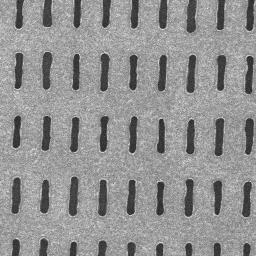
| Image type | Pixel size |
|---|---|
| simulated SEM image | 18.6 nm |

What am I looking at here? a regular array of holes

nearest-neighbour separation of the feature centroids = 530 nm